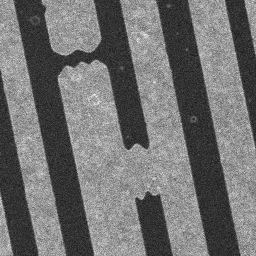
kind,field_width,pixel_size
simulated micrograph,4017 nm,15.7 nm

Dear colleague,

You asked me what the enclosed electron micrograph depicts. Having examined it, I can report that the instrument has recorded one or a few lines or trenches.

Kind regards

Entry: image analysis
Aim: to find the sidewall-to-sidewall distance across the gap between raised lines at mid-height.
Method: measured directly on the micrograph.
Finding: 449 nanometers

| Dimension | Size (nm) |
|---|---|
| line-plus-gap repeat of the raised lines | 1060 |